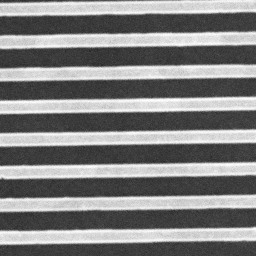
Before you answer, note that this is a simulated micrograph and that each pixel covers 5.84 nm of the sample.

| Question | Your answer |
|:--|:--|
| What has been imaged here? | parallel lines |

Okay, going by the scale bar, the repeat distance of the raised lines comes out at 190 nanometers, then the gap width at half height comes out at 0.128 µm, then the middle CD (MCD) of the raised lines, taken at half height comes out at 63.5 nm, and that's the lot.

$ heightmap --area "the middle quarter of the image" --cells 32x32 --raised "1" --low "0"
00000000000000000000000000000000
11111111111111111111111111111111
11111111111111111111111111111111
11111111100000000000000000000000
00000000000000000000000000000000
00000000000000000000000000000000
00000000000000000000000000000000
00000000000000000000000000000000
00000000000000000000000000000000
11111111111111111111111111111111
11111111111111111111111111111111
11111111111111111111100000000000
00000000000000000000000000000000
00000000000000000000000000000000
00000000000000000000000000000000
00000000000000000000000000000000
00000000000000000000000000000000
01111111111111111111111111111111
11111111111111111111111111111111
11111111111111111111111111111111
00000000000000000000000000000000
00000000000000000000000000000000
00000000000000000000000000000000
00000000000000000000000000000000
00000000000000000000000000000000
00000000000001111111111111111111
11111111111111111111111111111111
11111111111111111111111111111111
00000000000000000000000000000000
00000000000000000000000000000000
00000000000000000000000000000000
00000000000000000000000000000000